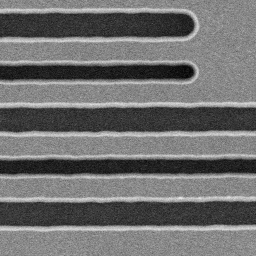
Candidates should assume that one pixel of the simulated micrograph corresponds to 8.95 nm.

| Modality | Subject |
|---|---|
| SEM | groups of lines, slits or small figures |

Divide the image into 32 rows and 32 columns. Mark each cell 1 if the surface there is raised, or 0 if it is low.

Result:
11111111111111111111111111111111
00000000000000000000000111111111
00000000000000000000000011111111
00000000000000000000000011111111
00000000000000000000000011111111
11111111111111111111111111111111
11111111111111111111111111111111
11111111111111111111111111111111
00000000000000000000000011111111
00000000000000000000000011111111
11111111111111111111111111111111
11111111111111111111111111111111
11111111111111111111111111111111
00000000000000000000000000000000
00000000000000000000000000000000
00000000000000000000000000000000
00000000000000000000000000000000
11111111111111111111111111111111
11111111111111111111111111111111
11111111111111111111111111111111
00000000000000000000000000000000
00000000000000000000000000000000
11111111111111111111111111111111
11111111111111111111111111111111
11111111111111111111111111111111
00000000000000000000000000000000
00000000000000000000000000000000
00000000000000000000000000000000
00000000000000000000000000110011
11111111111111111111111111111111
11111111111111111111111111111111
11111111111111111111111111111111